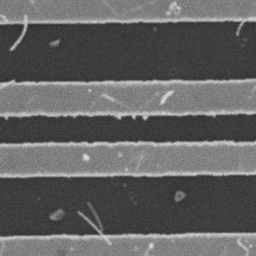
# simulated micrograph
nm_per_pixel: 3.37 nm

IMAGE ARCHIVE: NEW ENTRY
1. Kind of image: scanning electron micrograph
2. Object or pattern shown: lines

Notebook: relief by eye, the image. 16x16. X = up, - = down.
XXXXXXXXXXXXXXXX
-X--------------
----------------
----------------
----------------
XXXXXXXXXXXXXXXX
XXXXXXXXXXXXXXXX
----------------
----------------
XXXXXXXXXXXXXXXX
XXXXXXXXXXXXXXXX
----------------
----------------
----------------
----------------
XXXXXXXXXXXXXXXX